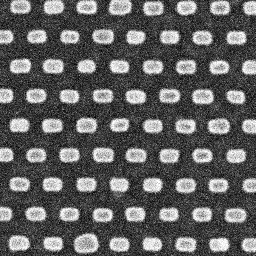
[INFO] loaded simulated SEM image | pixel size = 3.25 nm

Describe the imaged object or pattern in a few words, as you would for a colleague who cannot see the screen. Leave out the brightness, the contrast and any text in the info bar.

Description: a regular array of raised bodies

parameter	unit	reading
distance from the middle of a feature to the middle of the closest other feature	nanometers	107